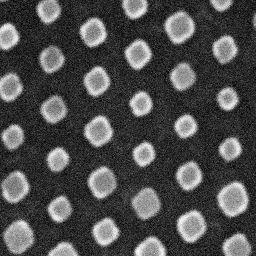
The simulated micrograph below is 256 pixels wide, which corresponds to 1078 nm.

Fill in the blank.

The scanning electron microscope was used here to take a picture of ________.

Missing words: a regular array of raised bodies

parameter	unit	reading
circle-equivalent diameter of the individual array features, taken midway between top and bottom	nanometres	99.2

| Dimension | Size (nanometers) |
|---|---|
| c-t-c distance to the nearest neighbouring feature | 209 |